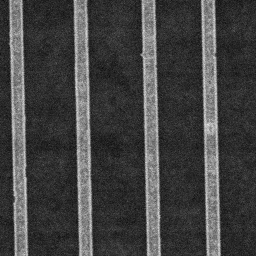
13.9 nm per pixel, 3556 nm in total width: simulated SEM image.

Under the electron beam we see one or a few lines or trenches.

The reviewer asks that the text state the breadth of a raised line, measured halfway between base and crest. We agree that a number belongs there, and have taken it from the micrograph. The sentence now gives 11.6 pixels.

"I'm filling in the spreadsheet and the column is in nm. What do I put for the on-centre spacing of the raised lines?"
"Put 890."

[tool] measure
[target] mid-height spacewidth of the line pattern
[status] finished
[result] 736 nanometers